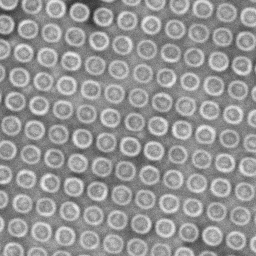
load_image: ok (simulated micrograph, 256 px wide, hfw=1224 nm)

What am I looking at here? a regular array of raised bodies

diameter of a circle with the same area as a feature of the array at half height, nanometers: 84.9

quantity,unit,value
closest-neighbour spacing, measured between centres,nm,114